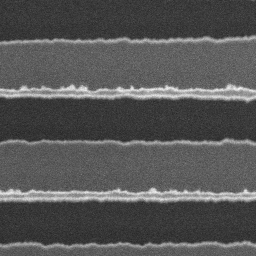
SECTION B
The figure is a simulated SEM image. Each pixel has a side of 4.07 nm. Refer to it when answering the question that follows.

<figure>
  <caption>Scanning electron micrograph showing lines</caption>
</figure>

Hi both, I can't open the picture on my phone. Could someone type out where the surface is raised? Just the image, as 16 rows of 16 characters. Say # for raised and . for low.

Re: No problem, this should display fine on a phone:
................
................
.......#...#####
################
################
################
................
................
................
################
################
################
..........#.....
................
................
################